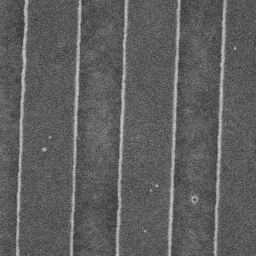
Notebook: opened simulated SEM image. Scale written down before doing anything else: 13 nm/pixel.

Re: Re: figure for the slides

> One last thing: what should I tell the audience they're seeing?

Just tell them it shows lines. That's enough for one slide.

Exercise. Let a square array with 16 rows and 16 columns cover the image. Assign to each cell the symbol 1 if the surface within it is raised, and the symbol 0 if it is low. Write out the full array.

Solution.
0011100011100011
0011100011100011
0011100011100011
0011100011100011
0111100011100011
0111100011100011
0111100011100011
0111100011100011
0111100011100011
0111100011100011
0111100011100011
0111100111100011
0111100111100011
0111100111100011
0111100111100111
0111000111100111